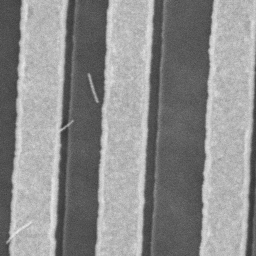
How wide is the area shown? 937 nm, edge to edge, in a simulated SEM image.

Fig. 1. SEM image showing lines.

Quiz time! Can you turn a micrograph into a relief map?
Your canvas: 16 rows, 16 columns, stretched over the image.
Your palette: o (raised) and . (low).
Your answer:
.ooo...ooo...ooo
.ooo...oo....ooo
.ooo...oo....ooo
.ooo...oo....ooo
.ooo...oo....ooo
.ooo...oo....ooo
.ooo..ooo....ooo
.ooo..ooo....ooo
.ooo..ooo....ooo
.ooo..ooo....ooo
.ooo..ooo....ooo
.ooo..ooo....ooo
.ooo..ooo....oo.
.oo...ooo....oo.
.oo...ooo....oo.
.oo...ooo....oo.